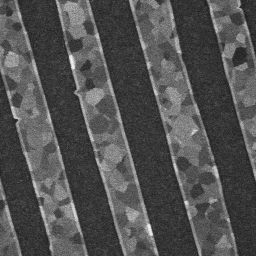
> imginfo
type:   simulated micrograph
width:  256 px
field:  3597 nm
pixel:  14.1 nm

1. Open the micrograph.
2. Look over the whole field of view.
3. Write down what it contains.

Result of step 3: one or a few lines or trenches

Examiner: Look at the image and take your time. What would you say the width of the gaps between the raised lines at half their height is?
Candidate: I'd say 547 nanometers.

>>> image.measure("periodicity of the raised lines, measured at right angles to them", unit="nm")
1010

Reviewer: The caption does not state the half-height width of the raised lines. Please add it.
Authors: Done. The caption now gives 452 nanometres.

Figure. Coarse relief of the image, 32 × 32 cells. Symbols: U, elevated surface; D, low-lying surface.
UUDDDDDUUUUDDDDDUUUUUDDDDDUUUUDD
UUDDDDDUUUUDDDDDDUUUUDDDDDUUUUDD
UUUDDDDDUUUUDDDDDUUUUUDDDDDUUUUD
UUUDDDDDUUUUDDDDDUUUUUDDDDDUUUUD
UUUDDDDDUUUUDDDDDDUUUUDDDDDUUUUD
UUUUDDDDUUUUDDDDDDUUUUDDDDDUUUUD
UUUUDDDDDUUUUDDDDDUUUUDDDDDDUUUU
UUUUDDDDDUUUUDDDDDUUUUUDDDDDUUUU
UUUUDDDDDUUUUDDDDDDUUUUDDDDDUUUU
UUUUUDDDDUUUUDDDDDDUUUUDDDDDUUUU
DUUUUDDDDDUUUUDDDDDUUUUUDDDDDUUU
DUUUUDDDDDUUUUDDDDDUUUUUDDDDDUUU
DUUUUUDDDDUUUUDDDDDDUUUUDDDDDUUU
DDUUUUDDDDUUUUUDDDDDUUUUUDDDDDUU
DDUUUUDDDDDUUUUDDDDDUUUUUDDDDDUU
DDUUUUDDDDDUUUUDDDDDDUUUUDDDDDUU
DDUUUUUDDDDUUUUDDDDDDUUUUUDDDDUU
DDDUUUUDDDDDUUUUDDDDDUUUUUDDDDDU
DDDUUUUDDDDDUUUUDDDDDUUUUUDDDDDU
DDDUUUUDDDDDUUUUDDDDDDUUUUDDDDDU
DDDDUUUUDDDDUUUUUDDDDDUUUUUDDDDD
DDDDUUUUDDDDDUUUUDDDDDUUUUUDDDDD
DDDDUUUUDDDDDUUUUDDDDDUUUUUDDDDD
DDDDUUUUUDDDDUUUUDDDDDDUUUUUDDDD
DDDDDUUUUDDDDDUUUUDDDDDUUUUUDDDD
UDDDDUUUUDDDDDUUUUDDDDDUUUUUDDDD
UDDDDUUUUDDDDDUUUUDDDDDDUUUUDDDD
UDDDDDUUUUDDDDUUUUDDDDDDUUUUUDDD
UUDDDDUUUUDDDDDUUUUDDDDDUUUUUDDD
UUDDDDUUUUDDDDDUUUUDDDDDUUUUUDDD
UUDDDDUUUUDDDDDUUUUDDDDDDUUUUDDD
UUDDDDUUUUUDDDDDUUUUDDDDDUUUUDDD